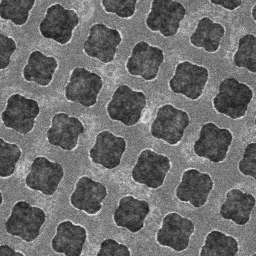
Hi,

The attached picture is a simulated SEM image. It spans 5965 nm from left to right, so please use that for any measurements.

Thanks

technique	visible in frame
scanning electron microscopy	a regular array of holes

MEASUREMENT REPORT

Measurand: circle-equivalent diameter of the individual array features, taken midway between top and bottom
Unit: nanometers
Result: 850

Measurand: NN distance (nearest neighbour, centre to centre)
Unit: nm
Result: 1100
